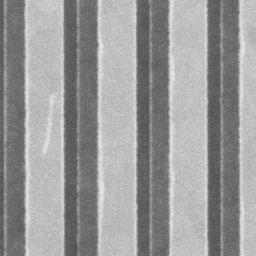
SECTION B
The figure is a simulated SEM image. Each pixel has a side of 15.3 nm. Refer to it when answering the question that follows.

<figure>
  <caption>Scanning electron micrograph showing lines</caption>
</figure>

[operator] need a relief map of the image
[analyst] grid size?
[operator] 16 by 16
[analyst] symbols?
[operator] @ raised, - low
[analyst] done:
--@@--@@---@@--@
--@@--@@---@@--@
--@@--@@---@@--@
--@@--@@---@@--@
--@@--@@---@@--@
--@@--@@---@@--@
--@@--@@---@@--@
--@@--@@---@@--@
--@@--@@---@@--@
--@@--@@@--@@--@
--@@--@@---@@--@
--@@--@@---@@--@
--@@--@@---@@--@
--@@--@@@--@@--@
--@@--@@---@@--@
--@@--@@@--@@--@